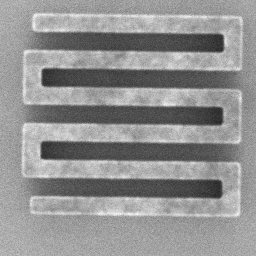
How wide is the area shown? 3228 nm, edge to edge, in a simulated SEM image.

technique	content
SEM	groups of lines, slits or small figures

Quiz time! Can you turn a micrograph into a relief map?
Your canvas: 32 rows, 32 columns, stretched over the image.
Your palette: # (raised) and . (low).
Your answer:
................................
................................
....##########################..
....##########################..
............................##..
............................##..
...#######..................##..
...###########################..
...###........################..
...##...........................
...##...........................
...###########################..
...###########################..
............................##..
............................##..
...##.......................##..
...###########################..
...###########################..
...##...........................
...##...........................
...###########################..
...###########################..
...........................###..
............................##..
............................##..
....##########################..
....##########################..
................................
................................
................................
................................
................................